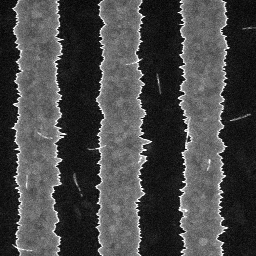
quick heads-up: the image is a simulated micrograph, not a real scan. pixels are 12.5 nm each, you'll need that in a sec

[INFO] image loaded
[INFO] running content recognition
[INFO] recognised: one or a few lines or trenches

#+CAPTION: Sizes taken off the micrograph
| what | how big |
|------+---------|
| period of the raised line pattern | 1030 nanometres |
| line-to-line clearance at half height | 42.3 pixels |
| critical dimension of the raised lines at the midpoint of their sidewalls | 501 nm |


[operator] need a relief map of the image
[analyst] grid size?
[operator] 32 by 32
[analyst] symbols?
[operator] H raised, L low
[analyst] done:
LLHHHHHLLLLLLHHHHHLLLLLHHHHHLLLL
LLHHHHHLLLLLHHHHHLLLLLLHHHHHLLLL
LLHHHHHLLLLLLHHHHHLLLLLHHHHHLLLL
LLHHHHHLLLLLLHHHHLLLLLLHHHHHLLLL
LLHHHHHLLLLLLHHHHLLLLLLHHHHHLLLL
LLHHHHHHLLLLLHHHHLLLLLLHHHHHLLLL
LLLHHHHHLLLLLHHHHLLLLLLHHHHHLLLL
LLHHHHHLLLLLLHHHHLLLLLLHHHHHLLLL
LLHHHHHLLLLLLHHHHLLLLLLHHHHHLLLL
LLHHHHHLLLLLLHHHHHLLLLLHHHHHLLLL
LLHHHHHLLLLLLHHHHHLLLLLHHHHHLLLL
LLHHHHHLLLLLHHHHHHLLLLLHHHHHLLLL
LLHHHHHLLLLLHHHHHLLLLLLHHHHHLLLL
LLHHHHHLLLLLLHHHHHLLLLLHHHHHLLLL
LLHHHHHHLLLLLHHHHHLLLLLHHHHHLLLL
LLHHHHHLLLLLLHHHHHLLLLLHHHHHLLLL
LLHHHHHHLLLLHHHHHHLLLLLHHHHLLLLL
LLHHHHHLLLLLHHHHHHLLLLLLHHHHLLLL
LLHHHHHLLLLLHHHHHHLLLLLHHHHHLLLL
LLHHHHHLLLLLLHHHHHLLLLLHHHHHLLLL
LLHHHHHLLLLLHHHHHHLLLLLHHHHHLLLL
LLHHHHHLLLLLHHHHHLLLLLLHHHHHLLLL
LLHHHHHLLLLLLHHHHLLLLLLHHHHHLLLL
LLHHHHHLLLLLHHHHHHLLLLLHHHHHLLLL
LLHHHHHLLLLLHHHHHHLLLLLHHHHHLLLL
LLHHHHHLLLLLHHHHHLLLLLLHHHHLLLLL
LLHHHHHLLLLLHHHHHLLLLLLHHHHLLLLL
LLHHHHHLLLLLHHHHHLLLLLLHHHHHLLLL
LLHHHHHLLLLLHHHHHLLLLLLHHHHHLLLL
LLHHHHHLLLLLHHHHHLLLLLLHHHHLLLLL
LLHHHHHLLLLLLHHHHLLLLLLHHHHHLLLL
LLHHHHHLLLLLHHHHHLLLLLLHHHHHLLLL